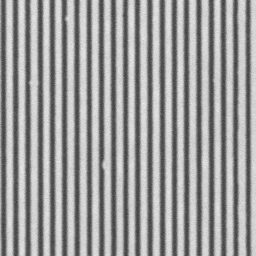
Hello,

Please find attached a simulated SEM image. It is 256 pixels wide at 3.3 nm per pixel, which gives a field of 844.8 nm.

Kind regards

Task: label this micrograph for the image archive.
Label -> parallel lines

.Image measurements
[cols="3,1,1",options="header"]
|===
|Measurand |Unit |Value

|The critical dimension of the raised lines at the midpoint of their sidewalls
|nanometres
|21.4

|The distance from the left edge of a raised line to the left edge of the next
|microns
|0.0403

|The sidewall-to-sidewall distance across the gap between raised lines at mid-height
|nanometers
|18.1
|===